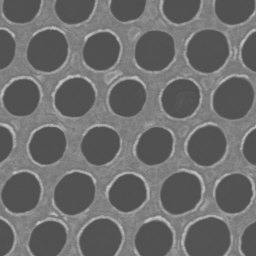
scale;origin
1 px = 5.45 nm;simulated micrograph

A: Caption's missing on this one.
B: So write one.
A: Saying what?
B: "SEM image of a regular array of holes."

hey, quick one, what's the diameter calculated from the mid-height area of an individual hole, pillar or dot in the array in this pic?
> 0.213 µm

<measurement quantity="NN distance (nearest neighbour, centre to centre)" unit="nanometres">287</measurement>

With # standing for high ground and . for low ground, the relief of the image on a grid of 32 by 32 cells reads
.....##.....##....##.....##.....
.....##....###....##.....##.....
#...####...####.#####...####...#
################################
.###....####..####...###....###.
..##....###....##.....##....##..
..#......#.....##.....#......#..
.##.....###....##.....##....##..
####...####...####...###...####.
################################
#...####...####...###...####...#
#....##.....##....##.....##.....
.....##.....##....##.....##.....
#....##....###....##.....##....#
##.#####..#####.#####...###....#
################################
.####...###...####...###....###.
..##....##.....##.....##....###.
..##....##.....##.....#.....##..
.###....##....###....###....###.
#####.#####..#####..#####..#####
################################
#....###....###...###....###...#
.....##.....##....##.....##.....
.....##.....##....##.....##.....
#....##....###....##.....##....#
##.#####..#####.#####..#####..##
############..###########...####
.###....###....##....###.....##.
..##....##.....##....##......#..
..##....##.....##....##......#..
.###....##.....##....##.....##..